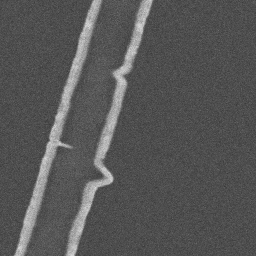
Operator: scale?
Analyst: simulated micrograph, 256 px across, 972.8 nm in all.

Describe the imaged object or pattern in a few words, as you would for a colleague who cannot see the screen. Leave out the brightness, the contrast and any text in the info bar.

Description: one or a few lines or trenches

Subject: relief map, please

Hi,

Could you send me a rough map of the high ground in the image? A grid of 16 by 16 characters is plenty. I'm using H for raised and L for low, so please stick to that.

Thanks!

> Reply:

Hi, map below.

HHHHHHLLLHHHHHHH
HHHHHHLLLHHHHHHH
HHHHHLLLHHHHHHHH
HHHHHLLLHHHHHHHH
HHHHHLLHHHHHHHHH
HHHHLLLHHHHHHHHH
HHHHLLLHHHHHHHHH
HHHHLLLHHHHHHHHH
HHHHLLLHHHHHHHHH
HHHLLLHHHHHHHHHH
HHHLLLHHHHHHHHHH
HHHLLLHHHHHHHHHH
HHLLLHHHHHHHHHHH
HHLLLHHHHHHHHHHH
HHLLLHHHHHHHHHHH
HLLLHHHHHHHHHHHH